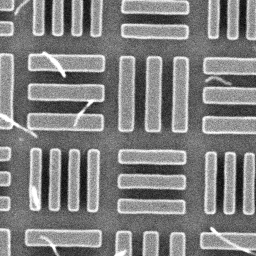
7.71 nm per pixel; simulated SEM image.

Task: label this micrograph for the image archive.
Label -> groups of lines, slits or small figures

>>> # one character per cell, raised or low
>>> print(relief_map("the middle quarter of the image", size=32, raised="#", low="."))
##########....####...###....###.
##########....####...###....###.
..............####...###....###.
..............###....###...####.
..............###....###...####.
##########....###....###...####.
##########....###....###...####.
##########....###....###...####.
##########....###....###...####.
......#.......###....###...####.
..............###....###...####.
..............###....###...####.
...##.........###....###...####.
##########....###...####...####.
##########....###...####...####.
##########....###....###...####.
.########.....###....###...####.
................................
................................
................................
................................
..#....#........................
.###..###.....################..
.###..###.....################..
.###..###.....################..
.###..###.......................
.###..###.......................
.###..###.......................
.###..##......################..
.###..##......################..
.###..##......################..
.###..##........................